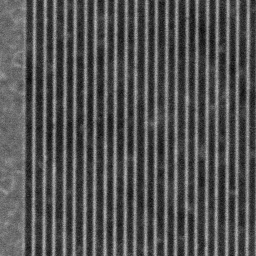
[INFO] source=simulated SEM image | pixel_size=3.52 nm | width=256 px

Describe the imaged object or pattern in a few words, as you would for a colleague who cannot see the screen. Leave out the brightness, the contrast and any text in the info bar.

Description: parallel lines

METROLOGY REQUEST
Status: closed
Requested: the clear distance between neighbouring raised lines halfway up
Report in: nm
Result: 30.3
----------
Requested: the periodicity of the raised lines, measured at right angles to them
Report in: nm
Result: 35.8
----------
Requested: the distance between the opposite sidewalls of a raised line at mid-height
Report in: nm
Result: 5.7